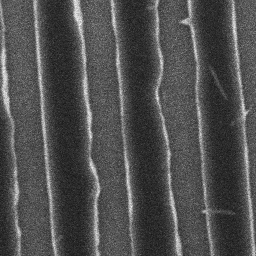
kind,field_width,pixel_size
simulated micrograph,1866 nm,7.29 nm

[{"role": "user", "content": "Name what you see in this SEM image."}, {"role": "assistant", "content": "one or a few lines or trenches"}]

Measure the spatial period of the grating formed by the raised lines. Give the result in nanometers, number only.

563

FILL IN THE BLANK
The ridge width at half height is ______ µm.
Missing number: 0.323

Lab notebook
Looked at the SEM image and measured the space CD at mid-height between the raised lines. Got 0.239 micrometres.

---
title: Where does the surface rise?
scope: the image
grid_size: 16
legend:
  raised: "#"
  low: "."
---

..###..###..###.
..###..###..###.
..###..###..###.
..###..###..###.
..###..###..###.
...##...##..###.
#..##...##..###.
#..###..##..###.
#..###..##..###.
#..###..###..##.
#..###..###..##.
#..###..###..###
#..###..###..###
#..###..###..###
#..###..###..###
#..###..###..###